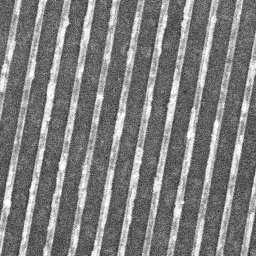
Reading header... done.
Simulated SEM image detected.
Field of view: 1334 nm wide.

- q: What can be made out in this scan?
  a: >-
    parallel lines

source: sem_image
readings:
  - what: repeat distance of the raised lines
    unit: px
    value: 24.3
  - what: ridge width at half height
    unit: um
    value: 0.0295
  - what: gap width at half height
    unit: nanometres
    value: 93.6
